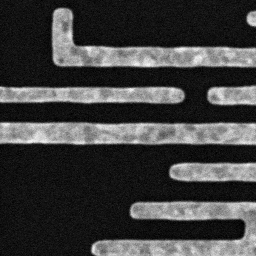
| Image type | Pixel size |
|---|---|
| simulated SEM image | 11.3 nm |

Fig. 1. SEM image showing wiring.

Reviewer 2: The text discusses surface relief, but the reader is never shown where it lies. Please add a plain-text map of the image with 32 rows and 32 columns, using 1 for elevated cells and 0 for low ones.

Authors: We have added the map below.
00000000000000000000000000000000
00000001100000000000000000000000
00000001100000000000000000000001
00000001100000000000000000000000
00000001100000000000000000000000
00000001100000000000000000000000
00000001111111111111111111111111
00000001111111111111111111111111
00000000000000000000000000000000
00000000000000000000000000000000
00000000000000000000000000000000
11111111111111111111111000111111
11111111111111111111111000111111
00000000000000000000000000000000
00000000000000000000000000000000
11110011111000000000000000010000
11111111111111111111111111111111
11111111111111111111111111111111
00000000000000000000000000000000
00000000000000000000000000000000
00000000000000000000000110011001
00000000000000000000011111111111
00000000000000000000000111111011
00000000000000000000000000000000
00000000000000000000000000000000
00000000000000000111111111111111
00000000000000001111111111111111
00000000000000000000000000000011
00000000000000000000000000000001
00000000000000000000000000000001
00000000000011111111111111111111
00000000000011111111111111111111